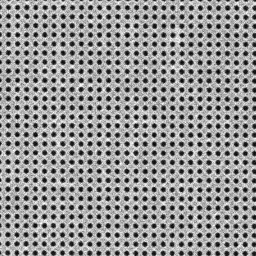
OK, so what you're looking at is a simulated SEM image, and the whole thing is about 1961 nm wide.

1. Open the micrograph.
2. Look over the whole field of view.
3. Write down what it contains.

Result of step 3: a regular array of holes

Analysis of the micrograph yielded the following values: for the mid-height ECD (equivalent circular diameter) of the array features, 40.5 nanometers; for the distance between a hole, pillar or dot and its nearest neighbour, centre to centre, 8.76 px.